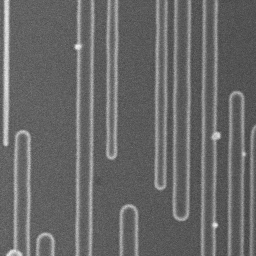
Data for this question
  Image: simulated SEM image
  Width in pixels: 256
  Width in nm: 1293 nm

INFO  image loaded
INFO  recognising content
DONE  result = groups of lines, slits or small figures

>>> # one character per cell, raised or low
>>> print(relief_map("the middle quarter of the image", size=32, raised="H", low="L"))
LLLLHHHLLLLHHLLLLLLLLLLHHHLLHHHL
LLLLHHHLLLLHHLLLLLLLLLLHHHLLHHHL
LLLLHHHLLLLHHLLLLLLLLLLHHHLLHHHL
LLLLHHHLLLLHHLLLLLLLLLLHHHLLHHHL
LLLLHHHLLLLHHLLLLLLLLLLHHHLLHHHL
LLLHHHHLLLLHHLLLLLLLLLLHHHLLHHHL
LLLHHHHLLLLHHLLLLLLLLLLHHHLLHHHL
LLLHHHHLLLLHHLLLLLLLLLLHHHLLHHHL
LLLHHHHLLLLHHLLLLLLLLLLHHHLLHHHL
LLLHHHHLLLLHHLLLLLLLLLLHHHLLHHHL
LLLHHHHLLLLHHLLLLLLLLLLHHHLLHHHL
LLLHHHHLLLLHHLLLLLLLLLLHHHLLHHHL
LLLHHHHLLLLHHLLLLLLLLLLHHHLLHHHL
LLLHHHHLLLLHHLLLLLLLLLLHHHLLHHHL
LLLHHHHLLLLHHLLLLLLLLLLHHLLLHHHL
LLLHHHHLLLLHHLLLLLLLLLLHHLLLHHHL
LLLHHHHLLLLHHLLLLLLLLLLHHLLLHHHL
LLLHHHHLLLLHHLLLLLLLLLLHHLLLHHHL
LLLHHHHLLLLHHLLLLLLLLLLHHLLLHHHL
LLLHHHHLLLLHHLLLLLLLLLLHHLLLHHHL
LLLHHHHLLLLHHLLLLLLLLLLHHLLLHHHL
LLLHHHHLLLLHHLLLLLLLLLLHHLLLHHHL
LLLHHHHLLLLHHLLLLLLLLLLHHLLLHHHL
LLLHHHHLLLLHHLLLLLLLLLLHHLLLHHHL
LLLHHHHLLLLLLLLLLLLLLLLHHLLLHHHL
LLLHHHHLLLLLLLLLLLLLLLLHHLLLHHHL
LLLHHHHLLLLLLLLLLLLLLLLHHLLLHHHL
LLLHHHHLLLLLLLLLLLLLLLLHHLLLHHHL
LLLHHHHLLLLLLLLLLLLLLLLHHLLLHHHL
LLLHHHHLLLLLLLLLLLLLLLLHHLLLHHHL
LLLHHHHLLLLLLLLLLLLLLLLHHLLLHHHL
LLLHHHHLLLLLLLLLLLLLLLLLLLLHHHHL